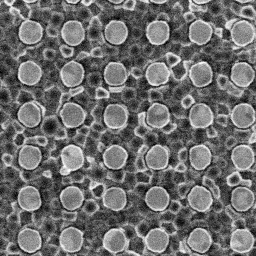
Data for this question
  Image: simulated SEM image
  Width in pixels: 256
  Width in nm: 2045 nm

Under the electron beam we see a regular array of raised bodies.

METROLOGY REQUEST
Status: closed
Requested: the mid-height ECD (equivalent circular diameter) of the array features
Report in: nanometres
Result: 188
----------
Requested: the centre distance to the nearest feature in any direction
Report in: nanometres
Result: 331